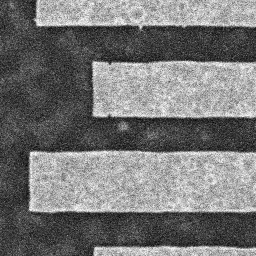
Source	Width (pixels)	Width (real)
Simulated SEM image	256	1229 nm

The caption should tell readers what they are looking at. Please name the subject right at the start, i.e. one or a few lines or trenches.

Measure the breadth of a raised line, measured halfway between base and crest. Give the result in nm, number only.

274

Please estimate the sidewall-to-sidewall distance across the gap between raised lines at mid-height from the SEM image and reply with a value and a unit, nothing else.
0.176 um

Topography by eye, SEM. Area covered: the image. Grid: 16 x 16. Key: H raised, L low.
LLHHHHHHHHHHHHHH
LLLHHHHHHHHHHHHH
LLLLLLLLLLLLLLLL
LLLLLLLLLLLLLLLL
LLLLLLHHHHHHHHHH
LLLLLLHHHHHHHHHH
LLLLLLHHHHHHHHHH
LLLLLLLLLLLLLLLL
LLLLLLLLLLLLLLLL
LLLLLLLHHLLLLLLL
LLHHHHHHHHHHHHHH
LLHHHHHHHHHHHHHH
LLHHHHHHHHHHHHHH
LLLLLLLLLLLLLLLL
LLLLLLLLLLLLLLLL
LLLLLLHLLHHLHHLL